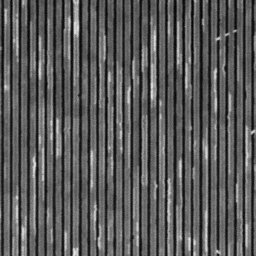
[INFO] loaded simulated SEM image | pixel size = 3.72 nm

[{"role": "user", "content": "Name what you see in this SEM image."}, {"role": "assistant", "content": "parallel lines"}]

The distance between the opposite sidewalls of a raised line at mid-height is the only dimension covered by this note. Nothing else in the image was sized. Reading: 17.7 nm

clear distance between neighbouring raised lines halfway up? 13.9 nanometres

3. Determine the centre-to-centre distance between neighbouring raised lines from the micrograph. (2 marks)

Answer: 32.1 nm